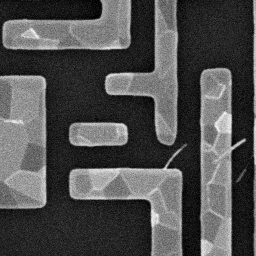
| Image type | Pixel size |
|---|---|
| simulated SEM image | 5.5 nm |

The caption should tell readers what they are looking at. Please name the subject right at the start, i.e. wiring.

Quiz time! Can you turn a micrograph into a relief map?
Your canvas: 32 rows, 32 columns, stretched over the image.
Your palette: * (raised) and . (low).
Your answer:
.............***...***..........
.............***...***..........
..**.......*****...***..........
****************...***..........
****************...***..........
****************...***..........
...................***..........
...................***..........
...................***..........
..............********...****...
******.......*********...****...
******.......*********...****...
******.............***...****...
******.............***...****...
******.............***...****...
******...******....***...****...
******...*******....**...****...
******...*******....**...****...
******...................****...
******...................****...
******...................****...
******...*************...****...
******...**************..****...
******...**************..****...
******...**************..****...
******.............****..****...
...................****..****...
...................****..****...
...................****..****...
...................****..****...
...................****..****...
...................****..****...